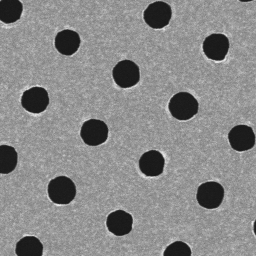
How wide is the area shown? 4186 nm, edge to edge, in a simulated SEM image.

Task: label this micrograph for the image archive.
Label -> a regular array of holes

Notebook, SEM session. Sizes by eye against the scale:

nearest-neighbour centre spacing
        1.08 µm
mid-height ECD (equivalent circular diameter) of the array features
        452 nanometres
